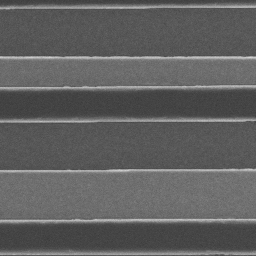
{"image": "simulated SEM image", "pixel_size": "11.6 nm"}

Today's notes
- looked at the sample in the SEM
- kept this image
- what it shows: lines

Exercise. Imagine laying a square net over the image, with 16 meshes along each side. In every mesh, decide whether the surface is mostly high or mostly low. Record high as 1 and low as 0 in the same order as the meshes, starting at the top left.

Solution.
1111111100000000
0000000000000000
0000000000000000
0000000000000000
1111111111111111
1111111111111111
1111111111111111
1111111111111111
0000000000000000
0000000000000000
0000000000000000
1111111111111111
1111111111111111
1111111111111111
1111111111111111
1111111111111111